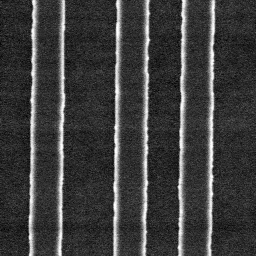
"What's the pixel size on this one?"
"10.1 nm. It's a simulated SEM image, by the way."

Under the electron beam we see lines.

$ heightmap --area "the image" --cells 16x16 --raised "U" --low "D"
DDUUDDDUUDDUUDDD
DDUUDDDUUDDUUDDD
DDUUDDDUUDDUUDDD
DDUUDDDUUDDUUDDD
DDUUDDDUUDDUUDDD
DDUUDDDUUDDUUDDD
DDUUDDDUUDDUUDDD
DDUUDDDUUDDUUDDD
DDUUDDDUUDDUUDDD
DDUUDDDUUDDUUDDD
DDUUDDDUUDDUUDDD
DDUUDDDUUDDUUDDD
DDUUDDDUUDDUUDDD
DDUUDDDUUDDUUDDD
DDUUDDDUUDDUUDDD
DDUUDDDUUDDUUDDD